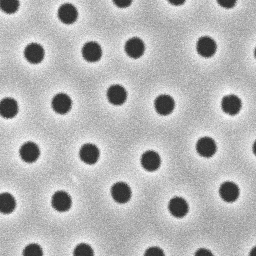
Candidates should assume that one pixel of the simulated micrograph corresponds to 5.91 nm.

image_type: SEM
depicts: a regular array of holes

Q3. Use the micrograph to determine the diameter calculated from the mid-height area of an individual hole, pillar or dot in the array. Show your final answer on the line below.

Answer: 131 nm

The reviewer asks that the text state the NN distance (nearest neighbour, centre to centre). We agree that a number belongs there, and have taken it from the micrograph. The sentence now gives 290 nm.